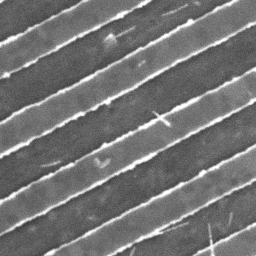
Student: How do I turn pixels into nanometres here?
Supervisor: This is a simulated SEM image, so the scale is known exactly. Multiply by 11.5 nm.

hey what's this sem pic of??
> one or a few lines or trenches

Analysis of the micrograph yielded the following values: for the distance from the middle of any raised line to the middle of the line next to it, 0.793 microns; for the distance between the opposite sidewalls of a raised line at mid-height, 358 nm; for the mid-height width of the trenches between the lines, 433 nanometers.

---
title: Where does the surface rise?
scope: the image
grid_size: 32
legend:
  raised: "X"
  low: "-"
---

----------XXXXXXXX----------XXXX
--------XXXXXXXX----------XXXXXX
------XXXXXXXX----------XXXXXXXX
----XXXXXXXX----------XXXXXXXXX-
--XXXXXXXX----------XXXXXXXXX---
XXXXXXXX-----X-----XXXXXXXX-----
XXXXXXX----------XXXXXXXX-------
XXXXX----------XXXXXXXX---------
XXX----------XXXXXXXX-----------
X----------XXXXXXXX-----------XX
----------XXXXXXXX----------XXXX
-------XXXXXXXXX----------XXXXXX
------XXXXXXXX----------XXXXXXXX
---XXXXXXXXX----------XXXXXXXX--
-XXXXXXXXX----------XXXXXXXXX---
XXXXXXXX----------XXXXXXXXX-----
XXXXXX----------XXXXXXXXX-------
XXXX----------XXXXXXXXX---------
XX----------XXXXXXXXX----------X
-----------XXXXXXXX----------XXX
---------XXXXXXXX----------XXXXX
-------XXXXXXXX----------XXXXXXX
-----XXXXXXXX-----------XXXXXXXX
---XXXXXXXXX----------XXXXXXXX--
-XXXXXXXX-----------XXXXXXXX----
XXXXXXXX----------XXXXXXXX------
XXXXXX----------XXXXXXXX--------
XXXX----------XXXXXXXX----------
XX----------XXXXXXXXX----------X
----------XXXXXXXXX----------XXX
--------XXXXXXXXX----------XXXXX
------XXXXXXXXX----------XXXXXXX